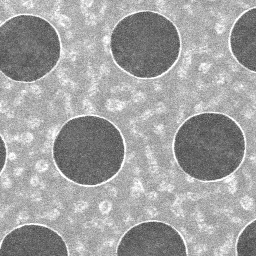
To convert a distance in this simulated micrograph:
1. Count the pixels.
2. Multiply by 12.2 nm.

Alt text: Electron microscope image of holes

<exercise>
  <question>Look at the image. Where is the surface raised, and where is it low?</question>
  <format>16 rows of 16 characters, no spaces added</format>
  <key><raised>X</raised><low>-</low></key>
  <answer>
XXXXXXXXXXXXXXXX
---XXXX----XXXX-
----XXX----XXX--
----XXX----XXXX-
---XXXXX--XXXXXX
XXXXXXXXXXXXXXXX
XXXXXXXXXXXXXXXX
XXXX---XXXXX---X
XXXX----XXX----X
XXX-----XXX----X
XXXX----XXX----X
XXXXX-XXXXXXXXXX
XXXXXXXXXXXXXXXX
XXXXXXXXXXXXXXXX
X--XXXXX---XXXX-
----XXX-----XXX-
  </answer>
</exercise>